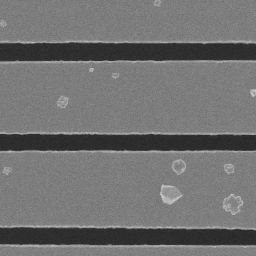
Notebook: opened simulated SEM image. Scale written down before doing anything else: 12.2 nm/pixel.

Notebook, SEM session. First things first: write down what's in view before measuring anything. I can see lines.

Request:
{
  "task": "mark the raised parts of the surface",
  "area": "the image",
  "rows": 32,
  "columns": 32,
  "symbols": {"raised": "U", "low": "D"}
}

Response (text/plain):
UUUUUUUUUUUUUUUUUUUUUUUUUUUUUUUU
UUUUUUUUUUUUUUUUUUUUUUUUUUUUUUUU
UUUUUUUUUUUUUUUUUUUUUUUUUUUUUUUU
UUUUUUUUUUUUUUUUUUUUUUUUUUUUUUUU
UUUUUUUUUUUUUUUUUUUUUUUUUUUUUUUU
DDDDDDDDDDDDDDDDDDDDDDDDDDDDDDDD
DDDDDDDDDDDDDDDDDDDDDDDDDDDDDDDD
DDDDDDDDDDDDDDDDDDDDDDDDDDDDDDDD
UUUUUUUUUUUUUUUUUUUUUUUUUUUUUUUU
UUUUUUUUUUUUUUUUUUUUUUUUUUUUUUUU
UUUUUUUUUUUUUUUUUUUUUUUUUUUUUUUU
UUUUUUUUUUUUUUUUUUUUUUUUUUUUUUUU
UUUUUUUUUUUUUUUUUUUUUUUUUUUUUUUU
UUUUUUUUUUUUUUUUUUUUUUUUUUUUUUUU
UUUUUUUUUUUUUUUUUUUUUUUUUUUUUUUU
UUUUUUUUUUUUUUUUUUUUUUUUUUUUUUUU
UUUUUUUUUUUUUUUUUUUUUUUUUUUUUUUU
DDDDDDDDDDDDDDDDDDDDDDDDDDDDDDDD
DDDDDDDDDDDDDDDDDDDDDDDDDDDDDDDD
UUUUUUUUUUUUUUUUUUUUUUUUUUUUUUUU
UUUUUUUUUUUUUUUUUUUUUUUUUUUUUUUU
UUUUUUUUUUUUUUUUUUUUUUUUUUUUUUUU
UUUUUUUUUUUUUUUUUUUUUUUUUUUUUUUU
UUUUUUUUUUUUUUUUUUUUUUUUUUUUUUUU
UUUUUUUUUUUUUUUUUUUUUUUUUUUUUUUU
UUUUUUUUUUUUUUUUUUUUUUUUUUUUUUUU
UUUUUUUUUUUUUUUUUUUUUUUUUUUUUUUU
UUUUUUUUUUUUUUUUUUUUUUUUUUUUUUUU
DDDDDDDDDDDDDDDDUDUUDUUUUUUUUUUU
DDDDDDDDDDDDDDDDDDDDDDDDDDDDDDDD
DDDDDDDDDDDDDDDDDDDDDDDDDDDDDDDD
UUUUUUUUUUUUUUUUUUUUUUUUUUUUUUUU